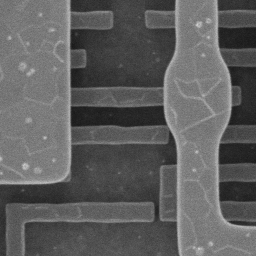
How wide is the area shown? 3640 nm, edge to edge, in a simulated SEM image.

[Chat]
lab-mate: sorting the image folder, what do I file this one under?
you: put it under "wiring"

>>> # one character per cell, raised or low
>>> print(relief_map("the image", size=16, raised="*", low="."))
****.......***..
****.......***..
****.......***..
****.......***..
****......****..
****......****..
****......****..
****......****..
****.......***..
****.......***..
****.......***..
...........***..
...........***..
...........***..
...........*****
...........*****